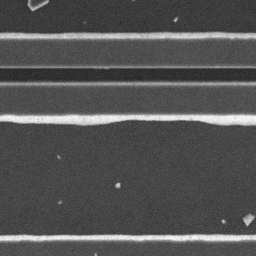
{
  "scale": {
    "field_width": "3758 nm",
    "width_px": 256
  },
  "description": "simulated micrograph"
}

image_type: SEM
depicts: lines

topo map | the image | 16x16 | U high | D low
DDDDDDDDDDDDDDDD
DDDDDDDDDDDDDDDD
UUUUUUUUUUUUUUUU
UUUUUUUUUUUUUUUU
UUUUUUUUUUUUUUUU
UUUUUUUUUUUUUUUU
UUUUUUUUUUUUUUUU
DDDDDDDDDDDDDDDD
DDDDDDDDDDDDDDDD
DDDDDDDDDDDDDDDD
DDDDDDDDDDDDDDDD
DDDDDDDDDDDDDDDD
DDDDDDDDDDDDDDDD
DDDDDDDDDDDDDDDD
DDDDDDDDDDDDDDDD
UUUUUUUUUUUUUUUU